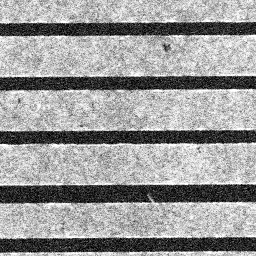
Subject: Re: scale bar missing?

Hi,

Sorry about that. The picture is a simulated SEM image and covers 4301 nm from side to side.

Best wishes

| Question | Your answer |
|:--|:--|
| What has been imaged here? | parallel lines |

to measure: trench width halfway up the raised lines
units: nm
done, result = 233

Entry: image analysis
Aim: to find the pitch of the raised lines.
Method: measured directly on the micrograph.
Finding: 917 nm